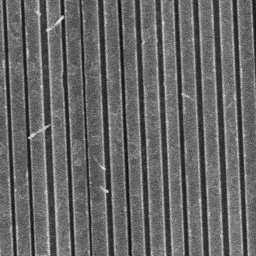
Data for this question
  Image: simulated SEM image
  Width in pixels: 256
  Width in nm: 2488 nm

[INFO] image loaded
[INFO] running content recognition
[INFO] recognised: parallel lines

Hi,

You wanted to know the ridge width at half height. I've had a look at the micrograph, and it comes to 137 nm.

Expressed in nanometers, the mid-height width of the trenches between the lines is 54.6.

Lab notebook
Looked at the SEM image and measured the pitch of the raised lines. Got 187 nm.